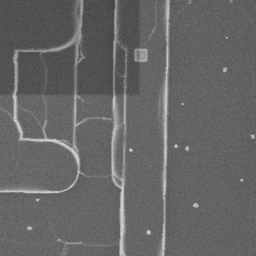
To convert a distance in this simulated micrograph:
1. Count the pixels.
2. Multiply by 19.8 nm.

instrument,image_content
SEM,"wiring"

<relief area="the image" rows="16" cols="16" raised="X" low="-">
XXXXX--XXXX-----
XXXXX--XXX------
XXXXX--XXX------
X------XXX------
X------XXX------
X------XXX------
X------XXX------
X------XXX------
XX-----XXX------
XXXXX--XXX------
XXXXX--XXX------
XXXXX--XXX------
--------XX------
--------XX------
--------XX------
--------XX------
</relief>